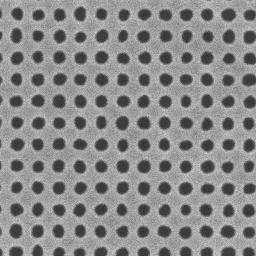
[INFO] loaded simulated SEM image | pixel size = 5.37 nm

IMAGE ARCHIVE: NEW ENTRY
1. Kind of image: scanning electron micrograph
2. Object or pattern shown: a regular array of holes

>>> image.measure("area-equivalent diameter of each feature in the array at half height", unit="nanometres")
69.1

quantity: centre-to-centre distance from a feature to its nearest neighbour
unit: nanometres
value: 112